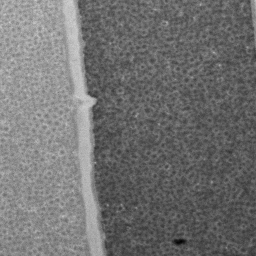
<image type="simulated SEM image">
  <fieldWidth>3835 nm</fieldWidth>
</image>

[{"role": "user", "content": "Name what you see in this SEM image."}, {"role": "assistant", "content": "one or a few lines or trenches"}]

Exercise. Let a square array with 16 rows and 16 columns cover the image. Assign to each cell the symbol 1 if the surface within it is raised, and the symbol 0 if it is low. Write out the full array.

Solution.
1111000000000000
1111000000000000
1111100000000000
1111100000000000
1111100000000000
1111100000000000
1111100000000000
1111100000000000
1111100000000000
1111100000000000
1111100000000000
1111100000000000
1111110000000000
1111110000000000
1111110000000000
1111110000000000